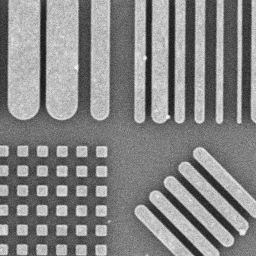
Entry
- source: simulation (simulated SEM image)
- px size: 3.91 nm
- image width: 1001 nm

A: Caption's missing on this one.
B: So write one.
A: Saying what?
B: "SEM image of groups of lines, slits or small figures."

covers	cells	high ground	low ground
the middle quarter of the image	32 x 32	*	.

***....****.......**..****..**..
***....****.......**..****..**..
***....****.......**..****..**..
***....****.......**..****..**..
***....****.......**..****..**..
***....****.......**..****..**..
***....****.......**..****..**..
***....****.......**..****..**..
***....****.......**..****..**..
***....****.......**..****..**..
***....****.......**..****..**..
***....****.......**..****..**..
**.....****.......**..****..**..
*.......**........**..****..**..
..................*....**...**..
................................
................................
................................
................................
................................
................................
*..***..***.....................
*..***..***.....................
................................
................................
.............................***
*..***..**...................***
*..***..**....................**
..........................**...*
.........................****..*
.........................*****..
*..***..**................*****.